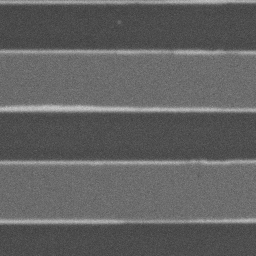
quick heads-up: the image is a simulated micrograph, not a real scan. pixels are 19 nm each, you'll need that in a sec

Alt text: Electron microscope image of lines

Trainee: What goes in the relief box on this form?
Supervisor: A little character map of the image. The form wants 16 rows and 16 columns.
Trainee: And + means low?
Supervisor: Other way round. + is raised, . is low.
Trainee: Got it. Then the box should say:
................
................
................
++++++++++++++++
++++++++++++++++
++++++++++++++++
++++++++++++++++
................
................
................
++++++++++++++++
++++++++++++++++
++++++++++++++++
++++++++++++++++
................
................